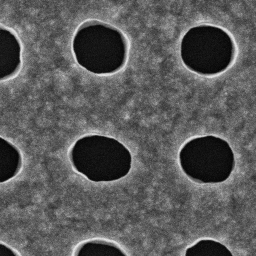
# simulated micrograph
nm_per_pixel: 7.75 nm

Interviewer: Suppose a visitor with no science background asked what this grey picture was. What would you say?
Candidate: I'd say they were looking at holes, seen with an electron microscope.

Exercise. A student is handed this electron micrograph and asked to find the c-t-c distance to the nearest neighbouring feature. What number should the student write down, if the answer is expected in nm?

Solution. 829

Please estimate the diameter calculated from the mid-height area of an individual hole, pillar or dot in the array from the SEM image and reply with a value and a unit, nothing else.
0.407 microns